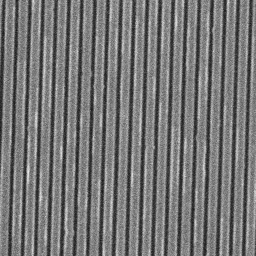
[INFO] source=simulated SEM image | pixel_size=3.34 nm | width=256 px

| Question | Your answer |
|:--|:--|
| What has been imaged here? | parallel lines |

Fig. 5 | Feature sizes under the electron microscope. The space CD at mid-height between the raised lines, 15.4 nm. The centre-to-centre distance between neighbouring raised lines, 43.4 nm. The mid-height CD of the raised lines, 28.3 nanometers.